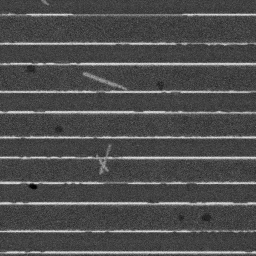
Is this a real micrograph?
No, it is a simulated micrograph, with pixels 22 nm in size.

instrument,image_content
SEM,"lines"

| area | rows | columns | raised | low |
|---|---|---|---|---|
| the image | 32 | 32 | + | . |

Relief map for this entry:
................................
................................
++++++++++++++++++++++++++++++++
++++++++++++++++++++++++++++++++
++++++++++++++++++++++++++++++++
......................++.++++++.
................................
................................
++++++++++++++++++++++++++++++++
++++++++++++++++++++++++++++++++
++++++++++++++++++++++++++++++++
................................
................................
................................
++++++++++++++++++++++++++++++++
++++++++++++++++++++++++++++++++
++++++++++++++++++++++++++++++++
................................
................................
................................
++++++++++++++++++++++++++++++++
++++++++++++++++++++++++++++++++
++++++++++++++++++++++++++++++++
................................
................................
++++++++++++++++++++++++++++++++
++++++++++++++++++++++++++++++++
++++++++++++++++++++++++++++++++
++++++++++++++++++++++++++++++++
................................
................................
................................